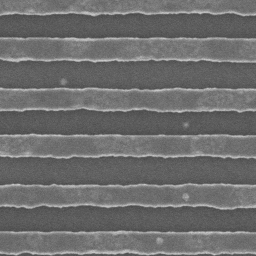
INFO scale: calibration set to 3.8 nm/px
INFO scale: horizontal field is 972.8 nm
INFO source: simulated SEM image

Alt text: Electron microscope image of lines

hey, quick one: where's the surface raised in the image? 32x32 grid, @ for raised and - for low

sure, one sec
@@@@@@@@@@@@@@@@@@@@@@@@@@@@@@@@
@@@@@@@@@@@@@@@@@@@@@@@@@@@@@@@@
--------------------------------
--------------------------------
--------------------------------
@@@@@@@@@@@@@@@@@@@@@@@@@@@@@@@@
@@@@@@@@@@@@@@@@@@@@@@@@@@@@@@@@
@@@@@@@@@@@@@@@@@@@@@-@@@@@@@@@@
--------------------------------
--------------------------------
--------------------------------
@@@@@@@@@@@@@@@@@@@@@@@@@@@@@@@@
@@@@@@@@@@@@@@@@@@@@@@@@@@@@@@@@
@@@@@@@@@@@@@@@@@@@@@@@@@@@@@@@@
--------------------------------
--------------------------------
--------------------------------
@@@@@@@@@@@@@@@@@@@@@@@@@@@@@@@@
@@@@@@@@@@@@@@@@@@@@@@@@@@@@@@@@
@@@@@@@@@@@@@-@@@@@@@@@@@-@@@@@@
--------------------------------
--------------------------------
--------------------------------
@@@@@@@@@@@@@@@@@@@@@@@@@@@@@@@@
@@@@@@@@@@@@@@@@@@@@@@@@@@@@@@@@
@@@@@@@@@@@@@@@@@@@@@@@@@@@@@@@@
--------------------------------
--------------------------------
--------------------------------
@@@@@@@@@@@@@@@@@@@@@@@@@@@@@@@@
@@@@@@@@@@@@@@@@@@@@@@@@@@@@@@@@
@@@@@@@@@@@@@@@@@@@@@@@@@@@@@@@@